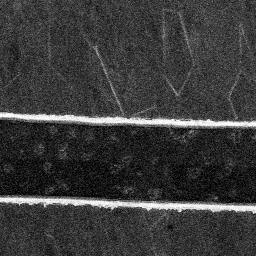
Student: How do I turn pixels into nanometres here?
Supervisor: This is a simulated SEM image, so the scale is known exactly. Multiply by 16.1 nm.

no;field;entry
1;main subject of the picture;one or a few lines or trenches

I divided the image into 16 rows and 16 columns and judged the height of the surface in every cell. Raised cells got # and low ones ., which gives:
################
################
################
################
################
################
################
.....###########
................
................
................
................
##..............
################
################
################